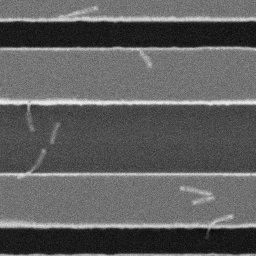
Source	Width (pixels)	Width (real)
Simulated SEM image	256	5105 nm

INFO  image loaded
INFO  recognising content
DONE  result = lines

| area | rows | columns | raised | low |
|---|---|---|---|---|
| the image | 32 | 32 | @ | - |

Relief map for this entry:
@@@@@@@@@@@@@@@@@@@@@@@@@@@@@@@@
@@@@@@@@@@@@@@@@@@@@@@@@@@@@@@@@
@@@@@@@@@@@@@@@@@@@@@@@@@@@@@@@@
--------------------------------
--------------------------------
--------------------------------
@@@@@@@@@@@@@@@@@@@@@@@@@@@@@@@@
@@@@@@@@@@@@@@@@@@@@@@@@@@@@@@@@
@@@@@@@@@@@@@@@@@@@@@@@@@@@@@@@@
@@@@@@@@@@@@@@@@@@@@@@@@@@@@@@@@
@@@@@@@@@@@@@@@@@@@@@@@@@@@@@@@@
@@@@@@@@@@@@@@@@@@@@@@@@@@@@@@@@
@@@@@@@@@@@@@@@@@@@@@@@@@@@@@@@@
--------------------------------
--------------------------------
--------------------------------
--------------------------------
--------------------------------
--------------------------------
--------------------------------
--------------------------------
--------------------------------
@@@@@@@@@@@@@@@@@@@@@@@@@@@@@@@@
@@@@@@@@@@@@@@@@@@@@@@@@@@@@@@@@
@@@@@@@@@@@@@@@@@@@@@@@@@@@@@@@@
@@@@@@@@@@@@@@@@@@@@@@@@@@@@@@@@
@@@@@@@@@@@@@@@@@@@@@@@@@@@@@@@@
@@@@@@@@@@@@@@@@@@@@@@@@@@@@@@@@
-----@---@@---------------@@-@--
--------------------------------
--------------------------------
--------------------------------